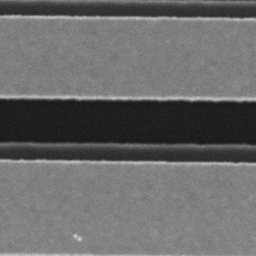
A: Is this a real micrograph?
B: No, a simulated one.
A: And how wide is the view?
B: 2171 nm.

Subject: lines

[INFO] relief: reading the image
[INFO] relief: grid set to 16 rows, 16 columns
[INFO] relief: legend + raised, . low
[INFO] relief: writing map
................
++++++++++++++++
++++++++++++++++
++++++++++++++++
++++++++++++++++
++++++++++++++++
................
................
................
................
++++++++++++++++
++++++++++++++++
++++++++++++++++
++++++++++++++++
++++++++++++++++
++++++++++++++++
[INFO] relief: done